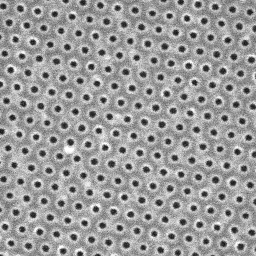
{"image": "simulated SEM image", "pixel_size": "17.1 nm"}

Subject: a regular array of holes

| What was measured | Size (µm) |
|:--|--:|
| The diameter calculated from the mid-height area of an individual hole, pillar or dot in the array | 0.128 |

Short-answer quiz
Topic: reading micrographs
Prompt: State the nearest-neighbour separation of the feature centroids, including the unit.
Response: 0.298 microns